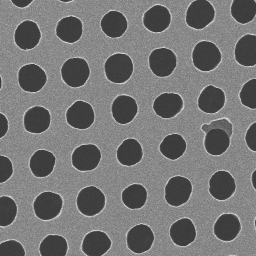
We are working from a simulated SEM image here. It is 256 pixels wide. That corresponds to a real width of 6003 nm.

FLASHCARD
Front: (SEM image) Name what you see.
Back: a regular array of holes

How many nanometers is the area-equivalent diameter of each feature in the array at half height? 634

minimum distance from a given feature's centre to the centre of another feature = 996 nanometers